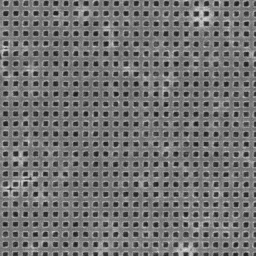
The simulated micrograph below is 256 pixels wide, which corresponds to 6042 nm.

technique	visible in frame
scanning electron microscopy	a regular array of holes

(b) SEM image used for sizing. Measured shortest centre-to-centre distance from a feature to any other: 228 nm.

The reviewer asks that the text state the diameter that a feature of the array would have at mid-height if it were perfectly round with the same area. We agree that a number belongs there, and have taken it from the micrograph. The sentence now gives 146 nm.